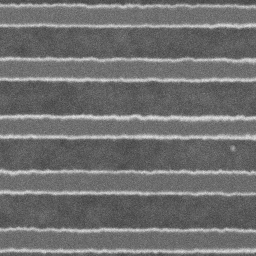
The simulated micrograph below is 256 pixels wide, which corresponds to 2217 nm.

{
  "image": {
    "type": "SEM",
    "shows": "lines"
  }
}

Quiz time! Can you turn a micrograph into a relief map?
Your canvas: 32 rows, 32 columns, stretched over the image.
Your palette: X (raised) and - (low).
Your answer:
--------------------------------
XXXXXXXXXXXXXXXXXXXXXXXXXXXXXXXX
XXXXXXXXXXXXXXXXXXXXXXXXXXXXXXXX
--------------------------------
--------------------------------
--------------------------------
--------------------------------
XXXXXXXXXXXXXXXXXXXXXXXXXXXXX-XX
XXXXXXXXXXXXXXXXXXXXXXXXXXXXXXXX
XXXXXXXXXXXXXXXXXXXXXXXXXXXXXXXX
--------------------------------
--------------------------------
--------------------------------
--------------------------------
--X-XXX---XX----X---------------
XXXXXXXXXXXXXXXXXXXXXXXXXXXXXXXX
XXXXXXXXXXXXXXXXXXXXXXXXXXXXXXXX
--------------------------------
--------------------------------
--------------------------------
--------------------------------
X-XXXXXXXXXXXXXXXXXXXXXXXXXX-XXX
XXXXXXXXXXXXXXXXXXXXXXXXXXXXXXXX
XXXXXXXXXXXXXXXXXXXXXXXXXXXXXXXX
--------------------------------
--------------------------------
--------------------------------
--------------------------------
--------------------------------
XXXXXXXXXXXXXXXXXXXXXXXXXXXXXXXX
XXXXXXXXXXXXXXXXXXXXXXXXXXXXXXXX
--------X---X-X-XX-XXXXXX-XXXX--